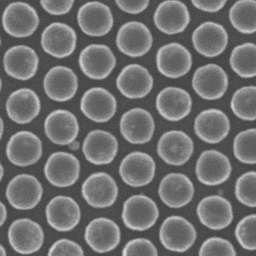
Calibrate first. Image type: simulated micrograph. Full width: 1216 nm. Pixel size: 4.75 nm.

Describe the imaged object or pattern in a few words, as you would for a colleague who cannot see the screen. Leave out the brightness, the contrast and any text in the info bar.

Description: a regular array of raised bodies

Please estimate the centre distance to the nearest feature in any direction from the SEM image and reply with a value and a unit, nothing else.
42.5 pixels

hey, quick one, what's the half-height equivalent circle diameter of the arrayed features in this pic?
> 163 nm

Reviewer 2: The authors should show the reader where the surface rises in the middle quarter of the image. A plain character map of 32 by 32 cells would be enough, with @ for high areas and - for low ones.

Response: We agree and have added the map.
----@@@@@@@@----@@@-----@@@@@@@@
@@---@@@@@@@---@@@@@@---@@@@@@@-
@@@--@@@@@@---@@@@@@@----@@@@@--
@@@----@@@---@@@@@@@@@----------
@@@----------@@@@@@@@@----------
@@@----------@@@@@@@@@----------
@@@---@@@@----@@@@@@@----@@@@@--
@@@--@@@@@@----@@@@@@---@@@@@@@-
@@---@@@@@@@@----------@@@@@@@@@
----@@@@@@@@@----------@@@@@@@@@
----@@@@@@@@@----------@@@@@@@@@
----@@@@@@@@@----@@@----@@@@@@@-
@@---@@@@@@@---@@@@@@---@@@@@@@-
@@@---@@@@@@---@@@@@@@----@@@---
@@@-----------@@@@@@@@----------
@@@-----------@@@@@@@@----------
@@@@----------@@@@@@@@----------
@@@---@@@@@----@@@@@@@---@@@@@--
@@@---@@@@@@@--@@@@@@@--@@@@@@@-
@@---@@@@@@@@----@@@----@@@@@@@@
-----@@@@@@@@-----------@@@@@@@@
-----@@@@@@@@-----------@@@@@@@@
@----@@@@@@@@----@@@----@@@@@@@@
@@@---@@@@@@---@@@@@@@---@@@@@@-
@@@@---@@@@----@@@@@@@----@@@@--
@@@@----------@@@@@@@@@---------
@@@@----------@@@@@@@@@---------
@@@@----@@----@@@@@@@@-----@@---
@@@---@@@@@@---@@@@@@@---@@@@@@-
@@---@@@@@@@@--@@@@@@---@@@@@@@@
@----@@@@@@@@-----@-----@@@@@@@@
-----@@@@@@@@-----------@@@@@@@@